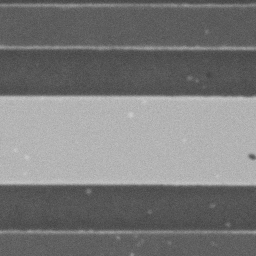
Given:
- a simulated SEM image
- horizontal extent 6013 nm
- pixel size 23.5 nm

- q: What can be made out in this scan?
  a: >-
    lines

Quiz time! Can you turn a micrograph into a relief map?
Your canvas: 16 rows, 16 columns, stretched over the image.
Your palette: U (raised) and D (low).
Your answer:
UUUUUUUUUUUUUUUU
UUUUUUUUUUUUUUUU
UUUUUUUUUUUUUUUU
DDDDDDDDDDDDDDDD
DDDDDDDDDDDDDDDD
DDDDDDDDDDDDDDDD
UUUUUUUUUUUUUUUU
UUUUUUUUUUUUUUUU
UUUUUUUUUUUUUUUU
UUUUUUUUUUUUUUUU
UUUUUUUUUUUUUUUU
DDDDDDDDDDUUDUUU
DDDDDDDDDDDDDDDD
DDDDDDDDDDDDDDDD
UUUUUUUUUUUUUUUU
UUUUUUUUUUUUUUUU